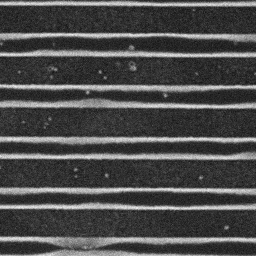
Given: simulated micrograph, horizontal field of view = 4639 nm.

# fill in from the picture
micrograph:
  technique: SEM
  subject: lines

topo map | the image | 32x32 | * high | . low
...................*********....
................................
................................
................................
.***********************........
********************************
********************************
................................
................................
................................
................................
********************************
********************************
................................
................................
................................
................................
*****.*.......**************..**
********************************
********************************
................................
................................
................................
................................
********************************
********************************
................................
................................
................................
................................
********************************
********************************